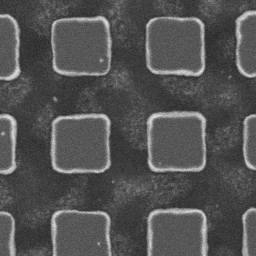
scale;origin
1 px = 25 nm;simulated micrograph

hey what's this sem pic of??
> raised bodies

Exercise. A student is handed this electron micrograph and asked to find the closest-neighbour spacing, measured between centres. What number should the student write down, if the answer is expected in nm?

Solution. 2370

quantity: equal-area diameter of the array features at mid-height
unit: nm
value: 1580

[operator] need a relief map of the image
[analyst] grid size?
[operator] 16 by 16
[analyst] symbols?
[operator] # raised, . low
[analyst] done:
................
#..####..####..#
#..####..####..#
#..####..####..#
#...###...##...#
................
................
#...###..####...
#..####..####..#
#..####..####..#
#...###...##....
................
................
#...###...###..#
#..####..####..#
#..####..####..#